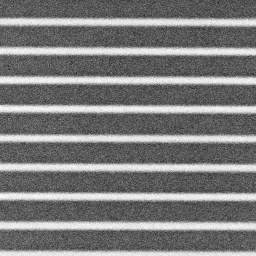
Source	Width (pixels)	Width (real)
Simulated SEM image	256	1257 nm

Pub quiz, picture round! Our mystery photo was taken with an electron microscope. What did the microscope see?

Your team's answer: parallel lines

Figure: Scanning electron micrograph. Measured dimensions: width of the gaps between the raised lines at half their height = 120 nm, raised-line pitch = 143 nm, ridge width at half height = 23.3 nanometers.